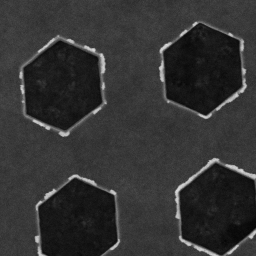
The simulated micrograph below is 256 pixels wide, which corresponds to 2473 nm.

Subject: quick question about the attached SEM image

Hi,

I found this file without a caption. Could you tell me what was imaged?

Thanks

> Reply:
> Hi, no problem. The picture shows holes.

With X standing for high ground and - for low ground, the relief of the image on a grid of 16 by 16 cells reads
XXXXXXXXXXXXXXXX
XXXXXXXXXXXXXXXX
XXXXXXXXXXX----X
XX----XXXX-----X
X-----XXXX-----X
X-----XXXX-----X
XX----XXXXX---XX
XX---XXXXXXXXXXX
XXXXXXXXXXXXXXXX
XXXXXXXXXXXXXXXX
XXXXXXXXXXXXX-XX
XXXX--XXXXXX----
XXX----XXXX-----
XX-----XXXX-----
XX-----XXXX-----
XXX----XXXXXX--X